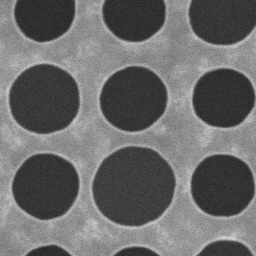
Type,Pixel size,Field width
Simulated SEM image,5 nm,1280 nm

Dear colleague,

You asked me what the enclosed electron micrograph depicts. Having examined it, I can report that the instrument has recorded holes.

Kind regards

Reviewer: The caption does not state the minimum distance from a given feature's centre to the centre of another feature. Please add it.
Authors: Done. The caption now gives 437 nm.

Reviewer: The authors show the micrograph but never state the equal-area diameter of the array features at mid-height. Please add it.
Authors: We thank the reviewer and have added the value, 334 nanometres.